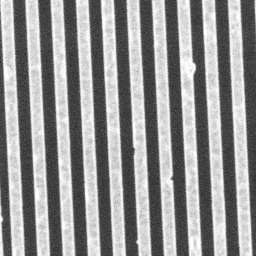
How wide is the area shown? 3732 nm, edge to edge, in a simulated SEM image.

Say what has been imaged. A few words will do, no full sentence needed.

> parallel lines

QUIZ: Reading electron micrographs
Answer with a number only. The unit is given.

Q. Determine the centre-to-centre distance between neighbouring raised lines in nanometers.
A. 368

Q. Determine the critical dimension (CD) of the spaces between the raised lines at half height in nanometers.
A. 202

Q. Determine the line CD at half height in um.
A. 0.168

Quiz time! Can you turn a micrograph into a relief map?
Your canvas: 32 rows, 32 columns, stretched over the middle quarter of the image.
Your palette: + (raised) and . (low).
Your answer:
....+++...+.+....++....+++...+++
....+++...+++....++....+++...+++
....+++...+++....++....+++....++
....+++...+++....++....+++...++.
....+++...+++....+++...+++...+++
....+++....++....+++...+++...+++
+...+++....++....+++...+++...+++
+...+++....++....+++...+++....++
+...+++....++....+++...+++....++
+...+++....++....+++...+++....++
+....++....++....+++....++....++
+....++....+++...+++....++....++
+....++....+++...+++....++....++
+....++....+++...+++....++....++
+....++....+++...+++....++....++
+....++....+++...+++....++....++
+....++....+.....+++....++....++
+....++....+++...+++....++....++
+....++....+++....++....++....++
+....+++...+++....++....++....++
+....+++...+++....++....++....++
+....+++...+++....++....+++...+.
+....+++...+++....++....+++...+.
+....+++...+++....++....+++...++
+....+++...+++....++....+++....+
+....+++...+++....+++...+++....+
+....+++....++....+++...+++....+
++...+++....++....+++...+++....+
++...+++....++....+++...++.....+
++...+++....++....++....+++....+
++...+++....++....+++...+++....+
++...+++....++....+++....++....+